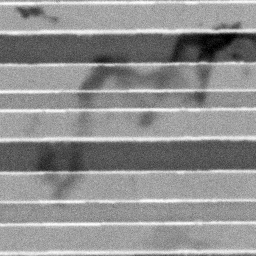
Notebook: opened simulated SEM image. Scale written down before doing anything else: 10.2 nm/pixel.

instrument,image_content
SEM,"lines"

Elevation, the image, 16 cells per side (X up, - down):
XXXXXXXXXXXXXXXX
XXXXXXXXXXXXXXXX
----------------
----------------
XXXXXXXXXXXXXXXX
XXXXXXXXXXXXXXXX
XXXXXXXXXXXXXXXX
XXXXXXXXXXXXXXXX
XXXXXXXXXXXXXXXX
----------------
----------------
XXXXXXXXXXXXXXXX
XXXXXXXXXXXXXXXX
XXXXXXXXXXXXXXXX
XXXXXXXXXXXXXXXX
XXXXXXXXXXXXXXXX